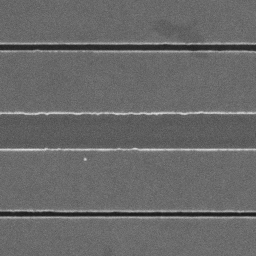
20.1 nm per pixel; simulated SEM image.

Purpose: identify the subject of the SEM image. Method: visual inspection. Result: lines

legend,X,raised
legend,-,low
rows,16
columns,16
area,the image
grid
XXXXXXXXXXXXXXXX
XXXXXXXXXXXXXXXX
XXXXXXXXXXXXXXXX
XXXXXXXXXXXXXXXX
XXXXXXXXXXXXXXXX
XXXXXXXXXXXXXXXX
XXXXXXXXXXXXXXXX
----------------
----------------
XXXXXXXXXXXXXXXX
XXXXXXXXXXXXXXXX
XXXXXXXXXXXXXXXX
XXXXXXXXXXXXXXXX
XXXXXXXXXXXXXXXX
XXXXXXXXXXXXXXXX
XXXXXXXXXXXXXXXX